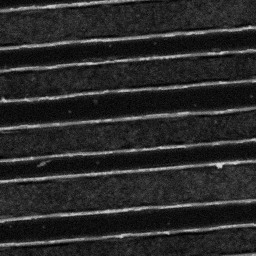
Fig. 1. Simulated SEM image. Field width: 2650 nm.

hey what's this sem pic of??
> parallel lines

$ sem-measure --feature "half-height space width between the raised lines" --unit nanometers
326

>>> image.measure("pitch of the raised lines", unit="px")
57.6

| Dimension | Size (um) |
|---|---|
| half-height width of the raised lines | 0.257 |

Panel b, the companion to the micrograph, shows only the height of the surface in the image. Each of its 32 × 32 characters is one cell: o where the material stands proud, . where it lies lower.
ooooooooooo.....................
................................
................................
...............................o
...................ooooooooooooo
.......ooooooooooooooooooooooooo
oooooooooooooooooooooooooooooo..
oooooooooooooooo................
ooooooo.........................
................................
.........................ooooooo
.............ooooooooooooooooooo
o..ooooooooooooooooooooooooooooo
oooooooooooooooooooooooooooooooo
ooooooooooooooooooo.............
oooooooo........................
................................
...............................o
...................ooooooooooooo
......oooooooooooooooooooooooooo
oooooooooooooooooooooooooooo....
oooooooooooooooo................
ooo.............................
................................
................................
.........................ooooooo
............oooooooooooooooooooo
.ooooooooooooooooooooooooooooooo
ooooooooooooooooooooooooooo.....
oooooooooooooooo................
oooo............................
................................